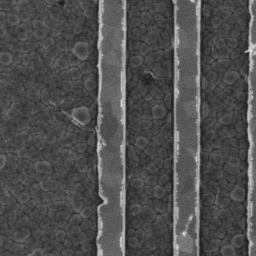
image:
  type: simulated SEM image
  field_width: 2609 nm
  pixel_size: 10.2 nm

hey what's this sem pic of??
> one or a few lines or trenches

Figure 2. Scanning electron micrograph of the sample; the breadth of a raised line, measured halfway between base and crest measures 24.6 pixels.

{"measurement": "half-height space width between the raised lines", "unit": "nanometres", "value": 512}